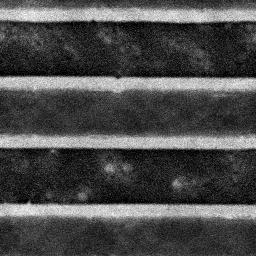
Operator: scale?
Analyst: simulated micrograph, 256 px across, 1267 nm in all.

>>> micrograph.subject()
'one or a few lines or trenches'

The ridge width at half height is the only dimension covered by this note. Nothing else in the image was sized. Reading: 287 nanometres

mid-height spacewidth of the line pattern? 344 nm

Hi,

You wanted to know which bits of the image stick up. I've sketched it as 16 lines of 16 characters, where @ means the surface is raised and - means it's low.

@@@@@@@@@@@@@@@@
----------------
----------------
----------------
----------------
@@@@@@@@@@@@@@@@
@@@@@@@@@@@@@@@@
@@@@@@@@@@@@@@@@
@@@@@@@@@@@@@@@@
----------------
----------------
----------------
----------------
@@@@@@@@@@@@@@@@
@@@@@@@@@@@@@@@@
@@@@@@@@@@@@@@@@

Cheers